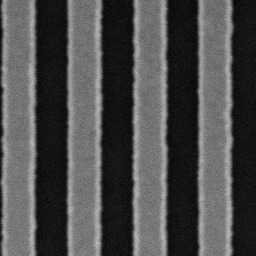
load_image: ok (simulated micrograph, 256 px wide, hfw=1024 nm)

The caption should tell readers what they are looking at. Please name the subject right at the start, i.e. lines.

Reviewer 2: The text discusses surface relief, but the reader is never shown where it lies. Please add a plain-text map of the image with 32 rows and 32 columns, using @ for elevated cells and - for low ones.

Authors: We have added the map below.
@@@@----@@@@@----@@@@----@@@@---
@@@@----@@@@@----@@@@----@@@@---
@@@@-----@@@@----@@@@----@@@@---
@@@@-----@@@@----@@@@----@@@@---
@@@@----@@@@@----@@@@----@@@@---
@@@@----@@@@@----@@@@----@@@@---
@@@@----@@@@@----@@@@----@@@@---
@@@@-----@@@@----@@@@----@@@@---
@@@@----@@@@@----@@@@----@@@@---
@@@@----@@@@@----@@@@----@@@@---
@@@@----@@@@@----@@@@----@@@@---
@@@@----@@@@@----@@@@----@@@@---
@@@@----@@@@@----@@@@----@@@@---
@@@@----@@@@@----@@@@----@@@@---
@@@@-----@@@@----@@@@----@@@@---
@@@@-----@@@@----@@@@----@@@@---
@@@@----@@@@@----@@@@----@@@@---
@@@@----@@@@@----@@@@----@@@@---
@@@@----@@@@@----@@@@----@@@@---
@@@@----@@@@@----@@@@----@@@@---
@@@@----@@@@@----@@@@----@@@@---
@@@@----@@@@@----@@@@----@@@@---
@@@@----@@@@@----@@@@----@@@@---
@@@@----@@@@@----@@@@----@@@@---
@@@@----@@@@@----@@@@----@@@@---
@@@@----@@@@@----@@@@----@@@@---
@@@@----@@@@@----@@@@----@@@@---
@@@@----@@@@-----@@@@----@@@@---
@@@@----@@@@@----@@@@----@@@@---
@@@@----@@@@@----@@@@----@@@@---
@@@@----@@@@@----@@@@----@@@@---
@@@@-----@@@@----@@@@----@@@@---